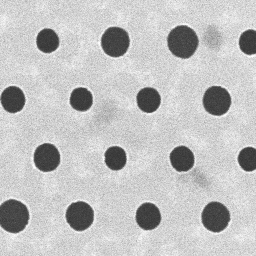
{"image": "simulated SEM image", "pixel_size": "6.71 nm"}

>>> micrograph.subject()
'a regular array of holes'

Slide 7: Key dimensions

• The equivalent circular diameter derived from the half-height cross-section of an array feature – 174 nanometers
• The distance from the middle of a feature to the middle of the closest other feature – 449 nm